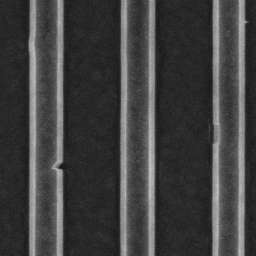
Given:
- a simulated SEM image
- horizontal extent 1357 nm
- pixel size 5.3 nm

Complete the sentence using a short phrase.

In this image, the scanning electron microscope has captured one or a few lines or trenches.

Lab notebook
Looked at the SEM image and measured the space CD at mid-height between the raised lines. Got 0.338 um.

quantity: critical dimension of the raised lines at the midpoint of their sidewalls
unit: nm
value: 148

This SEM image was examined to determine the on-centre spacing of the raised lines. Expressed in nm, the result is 484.